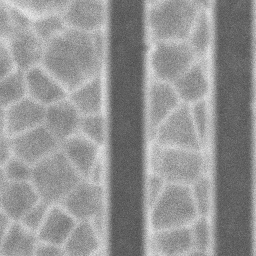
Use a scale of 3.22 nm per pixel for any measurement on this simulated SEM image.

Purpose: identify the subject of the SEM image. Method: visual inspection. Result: one or a few lines or trenches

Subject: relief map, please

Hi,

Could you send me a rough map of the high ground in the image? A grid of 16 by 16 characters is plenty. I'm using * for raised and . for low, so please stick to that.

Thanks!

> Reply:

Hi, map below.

*******..****...
*******..****...
*******..****...
*******..****...
*******..****...
*******..****...
*******..****...
*******..****...
*******..****...
*******..****...
*******..****...
*******..****...
*******..****...
*******..****...
*******..****...
*******..****...